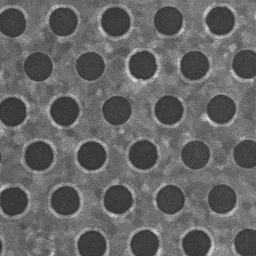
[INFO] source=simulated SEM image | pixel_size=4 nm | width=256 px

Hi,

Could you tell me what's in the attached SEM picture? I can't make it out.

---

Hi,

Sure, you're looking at a regular array of holes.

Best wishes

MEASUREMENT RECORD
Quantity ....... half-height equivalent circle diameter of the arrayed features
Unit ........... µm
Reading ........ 0.118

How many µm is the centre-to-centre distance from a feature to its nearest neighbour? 0.206